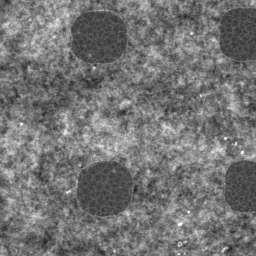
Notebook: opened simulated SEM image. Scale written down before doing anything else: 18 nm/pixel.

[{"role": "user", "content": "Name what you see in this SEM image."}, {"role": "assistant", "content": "raised bodies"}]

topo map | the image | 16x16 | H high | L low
LLLLLLLLLLLLLLLH
LLLLLHHHLLLLLLHH
LLLLLHHHLLLLLLHH
LLLLLHHHLLLLLLHH
LLLLLLLLLLLLLLLL
LLLLLLLLLLLLLLLL
LLLLLLLLLLLLLLLL
LLLLLLLLLLLLLLLL
LLLLLLLLLLLLLLLL
LLLLLLLLLLLLLLLL
LLLLLHHHLLLLLLHH
LLLLLHHHLLLLLLHH
LLLLLHHHLLLLLLHH
LLLLLLHLLLLLLLLL
LLLLLLLLLLLLLLLL
LLLLLLLLLLLLLLLL